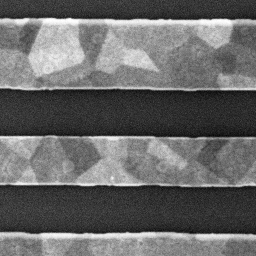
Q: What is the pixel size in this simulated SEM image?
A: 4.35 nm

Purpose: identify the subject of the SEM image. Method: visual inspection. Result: lines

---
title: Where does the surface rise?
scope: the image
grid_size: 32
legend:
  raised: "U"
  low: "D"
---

DDDDDDDDDDDDDDDDDDDDDDDDDDDDDDDD
DDDDDDDDDDDDDDDDDDDDDDDDDDDDDDDD
UUUUUUUUUUDDDDDDDDDDDDDDDDDDDDDD
UUUUUUUUUUUUUUUUUUUUUUUUUUUUUUUU
UUUUUUUUUUUUUUUUUUUUUUUUUUUUUUUU
UUUUUUUUUUUUUUUUUUUUUUUUUUUUUUUU
UUUUUUUUUUUUUUUUUUUUUUUUUUUUUUUU
UUUUUUUUUUUUUUUUUUUUUUUUUUUUUUUU
UUUUUUUUUUUUUUUUUUUUUUUUUUUUUUUU
UUUUUUUUUUUUUUUUUUUUUUUUUUUUUUUU
UUUUUUUUUUUUUUUUUUUUUUUUUUUUUUUU
DDDDDDDDDDDDDDDDDDDDDDDDDDDDDDDD
DDDDDDDDDDDDDDDDDDDDDDDDDDDDDDDD
DDDDDDDDDDDDDDDDDDDDDDDDDDDDDDDD
DDDDDDDDDDDDDDDDDDDDDDDDDDDDDDDD
DDDDDDDDDDDDDDDDDDDDDDDDDDDDDDDD
DDDDDDDDDDDDDDDDDDDDDDDDDDDDDDDD
UUUUUUUUUUUUUUUUUUUUUUUUUUUUUUUU
UUUUUUUUUUUUUUUUUUUUUUUUUUUUUUUU
UUUUUUUUUUUUUUUUUUUUUUUUUUUUUUUU
UUUUUUUUUUUUUUUUUUUUUUUUUUUUUUUU
UUUUUUUUUUUUUUUUUUUUUUUUUUUUUUUU
UUUUUUUUUUUUUUUUUUUUUUUUUUUUUUUU
DDDDDDDDDDDDDDDDDDDDDDDDDDDDDDDD
DDDDDDDDDDDDDDDDDDDDDDDDDDDDDDDD
DDDDDDDDDDDDDDDDDDDDDDDDDDDDDDDD
DDDDDDDDDDDDDDDDDDDDDDDDDDDDDDDD
DDDDDDDDDDDDDDDDDDDDDDDDDDDDDDDD
DDDDDDDDDDDDDDDDDDDDDDDDDDDDDDDD
UUUUUUUUUUUUUUUUUUUUUUUUUUUUUUUU
UUUUUUUUUUUUUUUUUUUUUUUUUUUUUUUU
UUUUUUUUUUUUUUUUUUUUUUUUUUUUUUUU